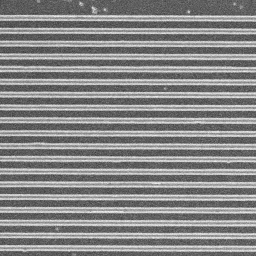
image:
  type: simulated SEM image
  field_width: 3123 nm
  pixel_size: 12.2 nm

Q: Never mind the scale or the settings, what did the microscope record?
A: parallel lines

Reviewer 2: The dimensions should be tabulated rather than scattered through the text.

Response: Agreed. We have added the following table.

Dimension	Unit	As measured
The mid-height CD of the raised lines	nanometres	51.8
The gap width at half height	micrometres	0.105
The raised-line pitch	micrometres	0.156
